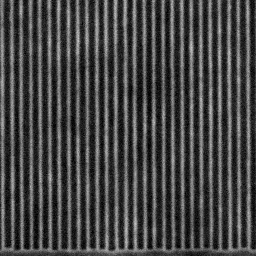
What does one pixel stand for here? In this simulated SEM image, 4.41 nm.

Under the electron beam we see parallel lines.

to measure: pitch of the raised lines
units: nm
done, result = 41.7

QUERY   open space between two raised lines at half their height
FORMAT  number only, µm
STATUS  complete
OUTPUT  0.0314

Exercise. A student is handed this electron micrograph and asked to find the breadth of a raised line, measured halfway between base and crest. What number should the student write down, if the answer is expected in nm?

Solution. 12.1